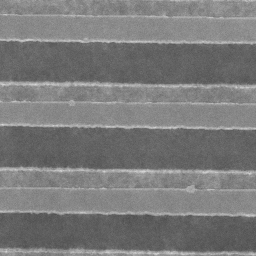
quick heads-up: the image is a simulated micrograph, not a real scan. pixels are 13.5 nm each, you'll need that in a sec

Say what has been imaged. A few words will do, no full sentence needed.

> lines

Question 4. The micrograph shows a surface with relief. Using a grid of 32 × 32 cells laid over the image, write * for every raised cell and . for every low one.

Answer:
********************************
********************************
********************************
********************************
********************************
................................
................................
................................
................................
................................
................................
********************************
********************************
********************************
********************************
********************************
................................
................................
................................
................................
................................
*****************.*.............
********************************
********************************
********************************
********************************
....*.**************************
................................
................................
................................
................................
*******......*..................